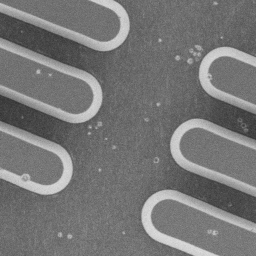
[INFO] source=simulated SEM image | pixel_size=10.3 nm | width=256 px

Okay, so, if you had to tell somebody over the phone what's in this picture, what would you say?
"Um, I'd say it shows groups of lines, slits or small figures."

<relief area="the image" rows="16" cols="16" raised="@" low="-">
@@@@@@@---------
---@@@@@--------
-----@@---------
@@-----------@@-
@@@@@--------@@@
@@@@@@-------@@@
--@@@@---------@
----------------
@@---------@@@@-
@@@@-------@@@@@
@@@@--------@@@@
--@@-----------@
----------@@----
---------@@@@@--
----------@@@@@@
------------@@@@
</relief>